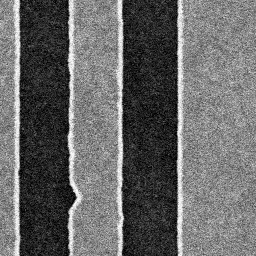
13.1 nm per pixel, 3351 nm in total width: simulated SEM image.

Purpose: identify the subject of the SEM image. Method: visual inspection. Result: one or a few lines or trenches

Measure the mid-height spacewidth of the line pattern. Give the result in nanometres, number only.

765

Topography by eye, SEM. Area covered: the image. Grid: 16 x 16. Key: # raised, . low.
#...###....#####
#...###....#####
#...####...#####
#...####...#####
#...###....#####
#...###....#####
#...###....#####
#...###....#####
#...####...#####
#...####...#####
#...####...#####
#....##....#####
#....##....#####
#...####...#####
#...###....#####
#...###....#####